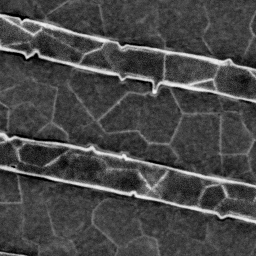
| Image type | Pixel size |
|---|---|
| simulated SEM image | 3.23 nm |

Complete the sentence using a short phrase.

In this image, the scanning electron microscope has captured one or a few lines or trenches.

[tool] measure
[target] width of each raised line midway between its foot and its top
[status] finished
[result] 109 nm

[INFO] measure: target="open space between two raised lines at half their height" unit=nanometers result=260